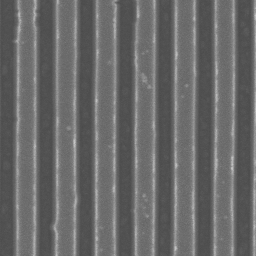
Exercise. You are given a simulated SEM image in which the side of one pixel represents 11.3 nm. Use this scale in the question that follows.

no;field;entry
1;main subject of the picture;parallel lines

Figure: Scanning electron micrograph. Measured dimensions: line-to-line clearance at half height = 197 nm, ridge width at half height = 0.247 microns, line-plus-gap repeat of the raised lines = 446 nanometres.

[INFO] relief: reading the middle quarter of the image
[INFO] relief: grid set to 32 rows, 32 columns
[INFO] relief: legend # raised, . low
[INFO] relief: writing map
###.....#####.....#####.....####
###.....#####.....#####.....####
###.....#####.....#####.....####
###.....#####.....#####.....####
###.....#####.....#####.....####
###.....#####.....#####.....####
###.....#####.....#####.....####
###.....#####.....#####.....####
###.....#####.....#####.....####
###.....#####.....#####.....####
###.....#####.....#####.....####
###.....#####.....#####.....####
###.....#####.....#####.....####
###.....#####.....#####.....####
###.....#####.....#####.....####
###.....#####.....#####.....####
###.....#####.....#####.....####
###.....#####.....#####.....####
###.....#####.....#####.....####
###.....#####.....#####.....####
###.....#####.....#####.....####
###.....#####.....#####....#####
###.....#####.....#####....#####
###.....#####.....#####....#####
###.....#####.....#####....#####
###.....#####.....#####....#####
###.....#####.....#####....#####
###.....#####.....#####....#####
###.....#####.....#####....#####
###.....#####.....#####....#####
###.....#####.....#####....#####
###.....#####.....#####....#####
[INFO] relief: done